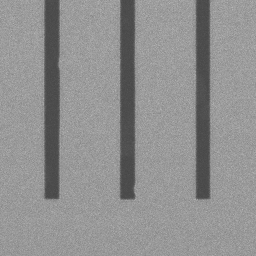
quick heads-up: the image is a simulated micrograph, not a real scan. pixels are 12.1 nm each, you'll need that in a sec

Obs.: one or a few lines or trenches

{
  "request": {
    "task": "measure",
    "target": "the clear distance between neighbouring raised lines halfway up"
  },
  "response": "718 nm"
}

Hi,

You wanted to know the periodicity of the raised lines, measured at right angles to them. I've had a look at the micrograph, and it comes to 917 nanometres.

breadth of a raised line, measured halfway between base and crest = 203 nm